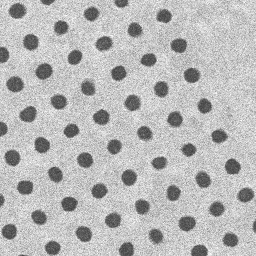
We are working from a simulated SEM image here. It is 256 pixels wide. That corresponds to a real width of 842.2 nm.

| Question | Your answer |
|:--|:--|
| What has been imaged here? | a regular array of holes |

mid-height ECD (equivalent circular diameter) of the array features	52.1	nm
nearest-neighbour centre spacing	106	nanometers